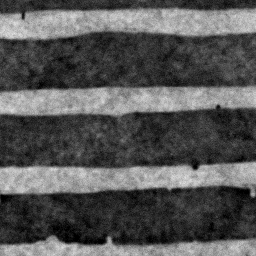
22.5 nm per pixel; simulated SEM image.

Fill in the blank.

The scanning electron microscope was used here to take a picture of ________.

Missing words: one or a few lines or trenches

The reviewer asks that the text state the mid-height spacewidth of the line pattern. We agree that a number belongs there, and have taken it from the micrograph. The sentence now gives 1220 nanometres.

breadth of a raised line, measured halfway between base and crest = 512 nm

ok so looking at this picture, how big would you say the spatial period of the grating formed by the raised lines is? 1750 nm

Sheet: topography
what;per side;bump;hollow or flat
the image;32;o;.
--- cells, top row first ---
................................
........oooooooooooooooooooooooo
oooooooooooooooooooooooooooooooo
oooooooooooooooooooooooooooooooo
oooooooo........................
................................
................................
................................
................................
................................
................................
...ooooooooooooooooooooooooooooo
oooooooooooooooooooooooooooooooo
oooooooooooooooooooooooooo......
..............o.................
................................
................................
................................
................................
................................
..............................oo
oooooooooooooooooooooooooooooooo
oooooooooooooooooooooooooooooooo
ooooooooooooooooooo..o.........o
................................
................................
................................
................................
................................
................................
....oooo.....o........oooooooooo
oooooooooooooooooooooooooooooooo